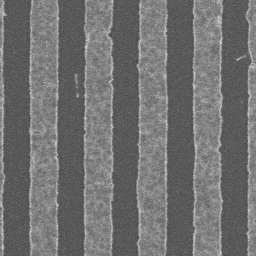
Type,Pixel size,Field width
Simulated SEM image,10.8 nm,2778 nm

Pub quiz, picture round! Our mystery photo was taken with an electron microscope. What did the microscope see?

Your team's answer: parallel lines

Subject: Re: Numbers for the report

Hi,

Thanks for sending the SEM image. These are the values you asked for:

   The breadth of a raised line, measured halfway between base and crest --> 26.5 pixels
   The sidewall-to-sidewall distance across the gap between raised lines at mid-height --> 27.4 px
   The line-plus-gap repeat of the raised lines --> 592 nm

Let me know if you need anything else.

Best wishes